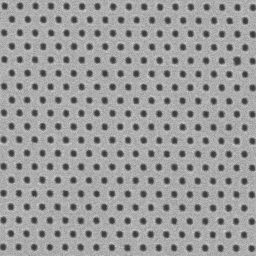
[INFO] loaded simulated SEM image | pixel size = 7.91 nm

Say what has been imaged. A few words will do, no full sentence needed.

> a regular array of holes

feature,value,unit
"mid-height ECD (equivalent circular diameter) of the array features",55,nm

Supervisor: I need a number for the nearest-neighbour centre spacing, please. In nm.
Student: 120